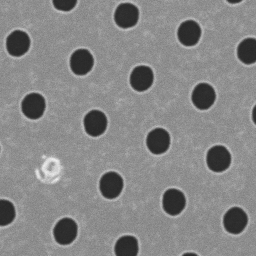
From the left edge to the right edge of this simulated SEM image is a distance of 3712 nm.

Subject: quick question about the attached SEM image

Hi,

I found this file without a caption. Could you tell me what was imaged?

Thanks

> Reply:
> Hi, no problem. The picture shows a regular array of holes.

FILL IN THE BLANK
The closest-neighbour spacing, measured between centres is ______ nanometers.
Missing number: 926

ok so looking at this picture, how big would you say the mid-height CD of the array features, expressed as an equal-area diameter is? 369 nm